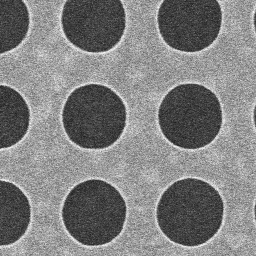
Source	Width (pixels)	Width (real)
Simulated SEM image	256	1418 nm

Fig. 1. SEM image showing holes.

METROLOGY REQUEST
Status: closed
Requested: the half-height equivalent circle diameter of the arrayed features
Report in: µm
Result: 0.362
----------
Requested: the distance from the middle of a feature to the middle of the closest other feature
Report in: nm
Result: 531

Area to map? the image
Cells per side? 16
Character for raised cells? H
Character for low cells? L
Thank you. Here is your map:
LLHHLLLLHHLLLLHH
LLHHLLLLHHLLLLHH
LHHHLLLHHHLLLHHH
HHHHHHHHHHHHHHHH
HHHHHHHHHHHHHHHH
LHHHHLLHHHHLLHHH
LLHHLLLLHHLLLLHH
LLHHLLLLHHLLLLHH
LHHHLLLHHHLLLLHH
HHHHHHHHHHHHHHHH
HHHHHHHHHHHHHHHH
LHHHHLLHHHHLLHHH
LLHHLLLLHHLLLLHH
LLHHLLLLHHLLLLHH
LLHHLLLHHHLLLLHH
HHHHHHHHHHHHHHHH